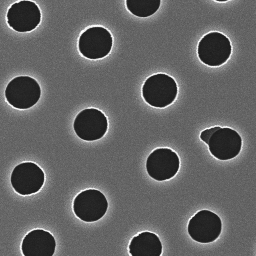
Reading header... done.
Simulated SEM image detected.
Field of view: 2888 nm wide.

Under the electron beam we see a regular array of holes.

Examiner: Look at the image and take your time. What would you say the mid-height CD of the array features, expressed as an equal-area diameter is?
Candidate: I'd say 374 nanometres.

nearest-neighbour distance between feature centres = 774 nanometres